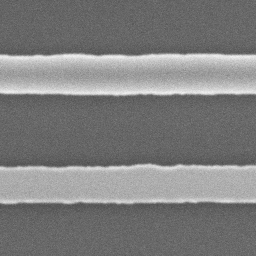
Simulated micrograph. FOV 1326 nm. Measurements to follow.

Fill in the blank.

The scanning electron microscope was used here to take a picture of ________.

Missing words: lines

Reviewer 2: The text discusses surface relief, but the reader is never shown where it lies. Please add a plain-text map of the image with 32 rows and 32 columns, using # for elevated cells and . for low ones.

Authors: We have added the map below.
................................
................................
................................
................................
................................
................................
................................
################################
################################
################################
################################
################################
................................
................................
................................
................................
................................
................................
................................
................................
................................
################################
################################
################################
################################
................................
................................
................................
................................
................................
................................
................................